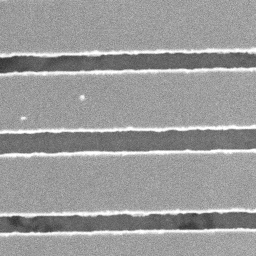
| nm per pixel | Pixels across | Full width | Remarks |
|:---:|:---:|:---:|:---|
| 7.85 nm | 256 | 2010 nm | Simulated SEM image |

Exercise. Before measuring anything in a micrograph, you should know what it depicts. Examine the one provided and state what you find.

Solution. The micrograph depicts lines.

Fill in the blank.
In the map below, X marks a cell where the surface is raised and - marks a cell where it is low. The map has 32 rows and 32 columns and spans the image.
XXXXXXXXXXXXXXXXXXXXXXXXXXXXXXXX
XXXXXXXXXXXXXXXXXXXXXXXXXXXXXXXX
XXXXXXXXXXXXXXXXXXXXXXXXXXXXXXXX
XXXXXXXXXXXXXXXXXXXXXXXXXXXXXXXX
XXXXXXXXXXXXXXXXXXXXXXXXXXXXXXXX
XXXXXXXXXXXXXXXXXXXXXXXXXXXXXXXX
XXXXXXXXXXXXXXXXXXXXX--X--------
--------------------------------
--------------------------------
XXXXXXXXXXXXXXXXXXXXXXXXXXXXXXXX
XXXXXXXXXXXXXXXXXXXXXXXXXXXXXXXX
XXXXXXXXXXXXXXXXXXXXXXXXXXXXXXXX
XXXXXXXXXXXXXXXXXXXXXXXXXXXXXXXX
XXXXXXXXXXXXXXXXXXXXXXXXXXXXXXXX
XXXXXXXXXXXXXXXXXXXXXXXXXXXXXXXX
XXXXXXXXXXXXXXXXXXXXXXXXXXXXXXXX
XXXXX-X-------------------------
--------------------------------
--------------------------------
XXXXXXXXXXXXXXXXXXXXXXXXXXXXXXXX
XXXXXXXXXXXXXXXXXXXXXXXXXXXXXXXX
XXXXXXXXXXXXXXXXXXXXXXXXXXXXXXXX
XXXXXXXXXXXXXXXXXXXXXXXXXXXXXXXX
XXXXXXXXXXXXXXXXXXXXXXXXXXXXXXXX
XXXXXXXXXXXXXXXXXXXXXXXXXXXXXXXX
XXXXXXXXXXXXXXXXXXXXXXXXXXXXXXXX
XXXXXXXXXXXXXXXXXXXXXXXXXXX----X
--------------------------------
--------------------------------
XXXXXXXXXXXXXXXXXXXXXXXXXXXXXXXX
XXXXXXXXXXXXXXXXXXXXXXXXXXXXXXXX
XXXXXXXXXXXXXXXXXXXXXXXXXXXXXXXX